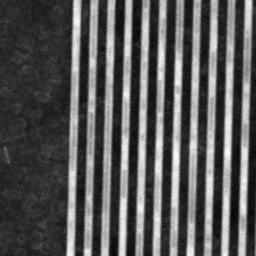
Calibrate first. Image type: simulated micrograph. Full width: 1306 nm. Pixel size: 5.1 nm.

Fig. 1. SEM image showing parallel lines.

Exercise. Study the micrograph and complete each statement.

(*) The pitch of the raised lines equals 0.0873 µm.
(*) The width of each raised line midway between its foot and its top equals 5.86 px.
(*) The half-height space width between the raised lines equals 55.4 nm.